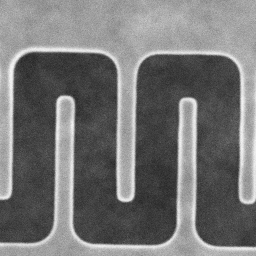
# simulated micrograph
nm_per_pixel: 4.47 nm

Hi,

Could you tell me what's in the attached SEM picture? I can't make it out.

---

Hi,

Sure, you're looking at groups of lines, slits or small figures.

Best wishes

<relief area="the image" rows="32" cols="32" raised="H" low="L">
HHHHHHHHHHHHHHHHHHHHHHHHHHHHHHHH
HHHHHHHHHHHHHHHHHHHHHHHHHHHHHHHH
HHHHHHHHHHHHHHHHHHHHHHHHHHHHHHHH
HHHHHHHHHHHHHHHHHHHHHHHHHHHHHHHH
HHHHHHHHHHHHHHHHHHHHHHHHHHHHHHHH
HHHHHHHHHHHHHHHHHHHHHHHHHHHHHHHH
HHHLLLLLLLLLHHHHHHHHHHHHHHHHHHHH
HHLLLLLLLLLLLLHHHHLLLLLLLLLLLHHH
HHLLLLLLLLLLLLLHHLLLLLLLLLLLLLHH
HLLLLLLLLLLLLLLHHLLLLLLLLLLLLLHH
HLLLLLLLLLLLLLLHHLLLLLLLLLLLLLHH
HHLLLLLLLLLLLLLHHLLLLLLLLLLLLLHH
HHLLLLLHHLLLLLLHHLLLLLLHLLLLLLHH
HHLLLLLHHLLLLLLHHLLLLLLHLLLLLLHH
HHLLLLLHHLLLLLLHHLLLLLLHLLLLLLHH
HHLLLLLHHLLLLLLHHLLLLLLHLLLLLLHH
HHLLLLLHHLLLLLLHHLLLLLLHLLLLLLHH
HHLLLLLHHLLLLLLHHLLLLLHHLLLLLLHH
HLLLLLLHHLLLLLLHHLLLLLHHLLLLLLHH
HLLLLLLHHLLLLLLHHLLLLLHHLLLLLLHH
HLLLLLLHHLLLLLLHHLLLLLHHLLLLLLHH
HLLLLLLHHLLLLLLHHLLLLLHHLLLLLLHH
HLLLLLLHHLLLLLLHHLLLLLHHLLLLLLHH
HLLLLLLHHLLLLLLHHLLLLLHHLLLLLLHH
HLLLLLLHHLLLLLLHHLLLLLHHLLLLLLHH
LLLLLLLHHLLLLLLLLLLLLLHHLLLLLLLL
LLLLLLLHHLLLLLLLLLLLLLHHLLLLLLLL
LLLLLLLHHLLLLLLLLLLLLLHHLLLLLLLL
LLLLLLLHHLLLLLLLLLLLLLHHLLLLLLLL
LLLLLLHHHHLLLLLLLLLLLLHHHLLLLLLL
HHHLHHHHHHHLLLLLLLLLHHHHHHLLLLLL
HHHHHHHHHHHHHHHHHHHHHHHHHHHHHHHH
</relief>